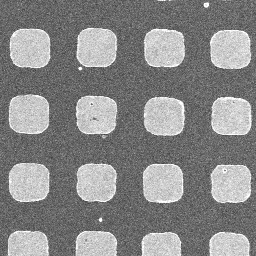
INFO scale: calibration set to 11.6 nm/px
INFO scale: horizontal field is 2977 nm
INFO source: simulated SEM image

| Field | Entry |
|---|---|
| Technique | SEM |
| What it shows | a regular array of raised bodies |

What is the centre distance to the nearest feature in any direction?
757 nanometres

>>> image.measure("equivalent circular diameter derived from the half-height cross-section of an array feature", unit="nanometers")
474